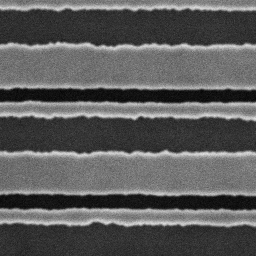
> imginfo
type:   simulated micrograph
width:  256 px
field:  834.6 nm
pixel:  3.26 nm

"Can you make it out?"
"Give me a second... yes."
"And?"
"lines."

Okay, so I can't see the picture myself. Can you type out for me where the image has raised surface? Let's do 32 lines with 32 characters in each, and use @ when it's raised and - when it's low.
@@@@@@@@@@@@@@@@@@@@@@@@@@@@@@@@
--------------------------------
--------------------------------
--------------------------------
--------------------------------
-@-----@@-@---------------------
@@@@@@@@@@@@@@@@@@@@@@@@@@@@@@@@
@@@@@@@@@@@@@@@@@@@@@@@@@@@@@@@@
@@@@@@@@@@@@@@@@@@@@@@@@@@@@@@@@
@@@@@@@@@@@@@@@@@@@@@@@@@@@@@@@@
@@@@@@@@@@@@@@@@@@@@@@@@@@@@@@@@
--------------------------------
--------------------------------
@@@@@@@@@@@@@@@@@@@@@@@@@@@@@@@@
--@-@@@@@---@@@@@@@@@@@@@@@@@@@@
--------------------------------
--------------------------------
--------------------------------
--------------------------------
@@@@@@@@@@@@@@@@@@@@@@@@@@@@@@@@
@@@@@@@@@@@@@@@@@@@@@@@@@@@@@@@@
@@@@@@@@@@@@@@@@@@@@@@@@@@@@@@@@
@@@@@@@@@@@@@@@@@@@@@@@@@@@@@@@@
@@@@@@@@@@@@@@@@@@@@@@@@@@@@@@@@
--------------------------------
--------------------------------
@@@@@@@@@@@@@@@@@@@@@@@@@@@@@@@@
@@@@@@@@@@@@@@@@@@@@@@@@@@@@@@@@
--------------------------------
--------------------------------
--------------------------------
--------------------------------